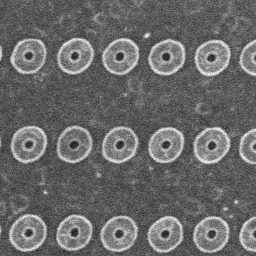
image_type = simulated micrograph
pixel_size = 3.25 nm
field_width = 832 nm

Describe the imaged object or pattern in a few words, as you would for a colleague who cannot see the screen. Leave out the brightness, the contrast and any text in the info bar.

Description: a regular array of ring-shaped raised bodies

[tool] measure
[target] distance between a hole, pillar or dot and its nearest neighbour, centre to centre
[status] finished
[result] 148 nm